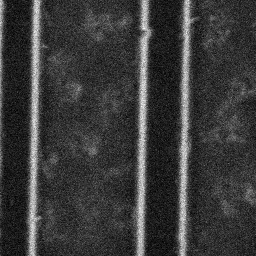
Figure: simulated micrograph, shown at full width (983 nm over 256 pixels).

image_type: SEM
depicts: one or a few lines or trenches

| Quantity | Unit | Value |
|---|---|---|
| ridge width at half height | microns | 0.162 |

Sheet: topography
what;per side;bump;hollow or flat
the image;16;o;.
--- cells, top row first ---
oo.......ooo....
oo.......ooo....
oo.......ooo....
oo.......ooo....
oo.......ooo....
oo.......ooo....
oo.......ooo....
oo.......ooo....
oo.......ooo....
oo.......ooo....
oo.......oo.....
oo.......oo.....
oo.......oo.....
oo.......oo.....
oo.......oo.....
oo.......oo.....